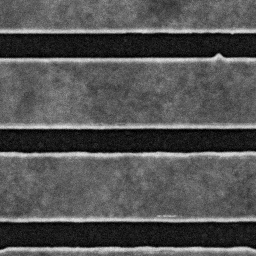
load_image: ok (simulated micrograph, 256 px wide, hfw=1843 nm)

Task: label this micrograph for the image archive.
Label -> one or a few lines or trenches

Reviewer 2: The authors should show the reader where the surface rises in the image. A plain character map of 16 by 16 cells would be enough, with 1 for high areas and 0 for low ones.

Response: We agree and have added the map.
1111111111111111
1111111111111111
0000000000000000
0000000000000000
1111111111111111
1111111111111111
1111111111111111
1111111111111111
0000000000000000
0000000000000000
1111111111111111
1111111111111111
1111111111111111
1111111111111111
0000000000000000
0000000000000000